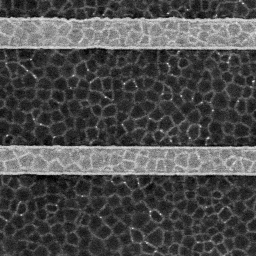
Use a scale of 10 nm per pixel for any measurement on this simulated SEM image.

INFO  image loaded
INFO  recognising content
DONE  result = one or a few lines or trenches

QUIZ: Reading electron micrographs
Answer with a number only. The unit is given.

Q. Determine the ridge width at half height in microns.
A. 0.265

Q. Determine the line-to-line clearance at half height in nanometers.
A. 999